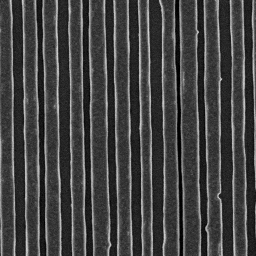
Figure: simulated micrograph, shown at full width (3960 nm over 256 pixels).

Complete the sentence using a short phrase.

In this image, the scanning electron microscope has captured parallel lines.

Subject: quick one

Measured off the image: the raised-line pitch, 0.357 micrometres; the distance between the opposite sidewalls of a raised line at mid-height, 220 nm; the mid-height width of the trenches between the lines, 0.145 um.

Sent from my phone